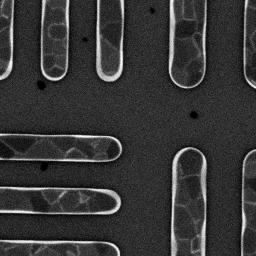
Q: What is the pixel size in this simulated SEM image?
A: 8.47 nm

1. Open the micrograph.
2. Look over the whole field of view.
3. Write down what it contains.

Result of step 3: groups of lines, slits or small figures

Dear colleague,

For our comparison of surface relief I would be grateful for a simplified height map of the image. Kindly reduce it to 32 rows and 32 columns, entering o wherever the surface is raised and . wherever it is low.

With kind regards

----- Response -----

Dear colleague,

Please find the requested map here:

oo....oo....ooo.......oooo.....o
oo...ooo....ooo.......oooo.....o
o....ooo....ooo.......oooo.....o
o....oooo...ooo.......oooo.....o
o....oooo...ooo.......ooo......o
o....ooo....ooo.......ooo......o
o....ooo....ooo.......oooo.....o
o....ooo....ooo......ooooo.....o
o....ooo....ooo......ooooo.....o
......oo.....oo......oooo......o
......................ooo......o
................................
................................
................................
................................
................................
................................
oooooooooooooo..................
ooooooooooooooo........o........
ooooooooooooooo.......ooo......o
......................ooo.....oo
......................ooo.....oo
......................ooo.....oo
oo....................ooo.....oo
oooooooooooooo........oooo....oo
ooooooooooooooo.......oooo....oo
....oooooooooo........oooo....oo
......................oooo....oo
......................ooo.....oo
......................ooo.....oo
oooooooooooooo........ooo.....oo
ooooooooooooooo.......ooo.....oo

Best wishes